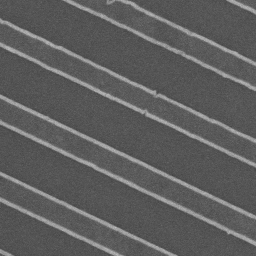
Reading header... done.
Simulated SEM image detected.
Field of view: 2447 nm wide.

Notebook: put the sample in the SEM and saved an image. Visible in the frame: one or a few lines or trenches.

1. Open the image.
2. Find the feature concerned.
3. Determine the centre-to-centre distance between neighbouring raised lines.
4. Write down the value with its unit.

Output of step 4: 666 nm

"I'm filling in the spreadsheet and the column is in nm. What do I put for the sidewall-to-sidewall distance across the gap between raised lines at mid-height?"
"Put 438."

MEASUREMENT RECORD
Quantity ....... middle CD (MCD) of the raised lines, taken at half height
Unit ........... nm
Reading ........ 230